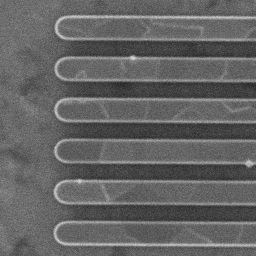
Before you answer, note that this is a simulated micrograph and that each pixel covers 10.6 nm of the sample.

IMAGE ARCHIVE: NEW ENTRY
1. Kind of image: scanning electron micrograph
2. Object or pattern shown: groups of lines, slits or small figures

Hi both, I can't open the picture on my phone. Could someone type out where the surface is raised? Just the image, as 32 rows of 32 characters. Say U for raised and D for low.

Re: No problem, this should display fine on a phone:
DDDDDDDDDDDDDDDDDDDDDDDDDDDDDDDD
DDDDDDDDDDDDDDDDDDDDDDDDDDDDDDDD
DDDDDDDUUUUUUUUUUUUUUUUUUUUUUUUU
DDDDDDDUUUUUUUUUUUUUUUUUUUUUUUUU
DDDDDDDDUUUUUUUUUUUUUUUUUUUUUUUU
DDDDDDDDDDDDDDDDDDDDDDDDDDDDDDDD
DDDDDDDDDDDDDDDDDDDDDDDDDDDDDDDD
DDDDDDDDUUUUUUUUUUUUUUUUUUUUUUUU
DDDDDDDUUUUUUUUUUUUUUUUUUUUUUUUU
DDDDDDDUUUUUUUUUUUUUUUUUUUUUUUUU
DDDDDDDDDDDDDDDDDDDDDDDDDDDDDDDD
DDDDDDDDDDDDDDDDDDDDDDDDDDDDDDDD
DDDDDDDDUUUUUUUUUUUUUUUUUUUUUUUU
DDDDDDDUUUUUUUUUUUUUUUUUUUUUUUUU
DDDDDDDUUUUUUUUUUUUUUUUUUUUUUUUU
DDDDDDDDDDDDDDDDDDDDDDDDDDDDDDDD
DDDDDDDDDDDDDDDDDDDDDDDDDDDDDDDD
DDDDDDDDUUUUUUDDDDDDDDDDDDDDDDDD
DDDDDDDUUUUUUUUUUUUUUUUUUUUUUUUU
DDDDDDDUUUUUUUUUUUUUUUUUUUUUUUUU
DDDDDDDDDDDDDDDDDDDDDDDDDDDDDDDU
DDDDDDDDDDDDDDDDDDDDDDDDDDDDDDDD
DDDDDDDDDDDDDDDDDDDDDDDDDDDDDDDD
DDDDDDDUUUUUUUUUUUUUUUUUUUUUUUUU
DDDDDDDUUUUUUUUUUUUUUUUUUUUUUUUU
DDDDDDDDDDDDDDDDDDDDDDUUUUUUUUUU
DDDDDDDDDDDDDDDDDDDDDDDDDDDDDDDD
DDDDDDDDDDDDDDDDDDDDDDDDDDDDDDDD
DDDDDDDUUUUUUUUUUUUUUUUUUUUUUUUU
DDDDDDDUUUUUUUUUUUUUUUUUUUUUUUUU
DDDDDDDDUUUUUUUUUUUUUUUUUUUUUUUU
DDDDDDDDDDDDDDDDDDDDDDDDDDDDDDDD